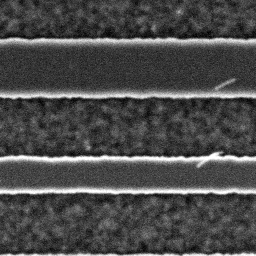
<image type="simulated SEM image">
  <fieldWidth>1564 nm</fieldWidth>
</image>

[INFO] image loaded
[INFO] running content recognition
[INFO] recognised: lines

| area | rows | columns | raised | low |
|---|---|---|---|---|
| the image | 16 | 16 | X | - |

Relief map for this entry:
----------------
----------------
XXXXXXXXXXXXXXXX
XXXXXXXXXXXXXXXX
XXXXXXXXXXXXXXXX
XXXXXXXXXXXXXXXX
----------------
----------------
----------------
----------------
XXXXXXXXXXXXXXXX
XXXXXXXXXXXXXXXX
----------------
----------------
----------------
----------------